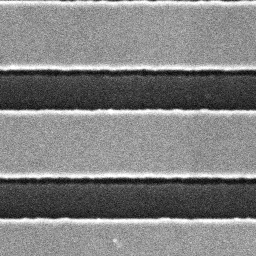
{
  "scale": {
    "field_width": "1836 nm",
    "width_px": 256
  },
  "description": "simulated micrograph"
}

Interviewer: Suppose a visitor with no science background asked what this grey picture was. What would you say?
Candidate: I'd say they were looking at lines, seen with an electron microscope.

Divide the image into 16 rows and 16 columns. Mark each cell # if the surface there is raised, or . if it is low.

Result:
################
################
################
################
................
................
................
################
################
################
################
................
................
................
################
################